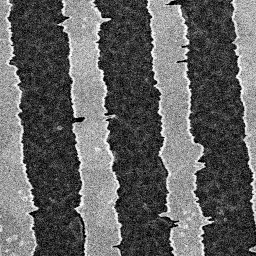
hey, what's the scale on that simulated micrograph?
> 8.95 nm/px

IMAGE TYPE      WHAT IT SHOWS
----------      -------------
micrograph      one or a few lines or trenches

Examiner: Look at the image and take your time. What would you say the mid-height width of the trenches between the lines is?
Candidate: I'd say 472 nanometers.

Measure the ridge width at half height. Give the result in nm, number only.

281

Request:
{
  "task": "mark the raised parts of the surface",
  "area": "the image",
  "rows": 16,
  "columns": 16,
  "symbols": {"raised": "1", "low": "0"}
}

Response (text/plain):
1000110001100001
1000110001110001
1000110000110001
1000110000110001
1000110000110001
1000011000110001
1000011000110001
1000011000110001
1000011000110001
1000011000111000
1100011000110000
1100011000110000
1100011000110000
1100011000011000
1100011100011000
1100011000011000